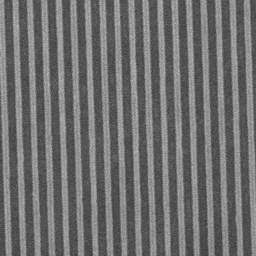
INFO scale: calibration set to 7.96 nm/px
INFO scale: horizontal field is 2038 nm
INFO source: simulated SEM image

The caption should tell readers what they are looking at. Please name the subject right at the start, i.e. parallel lines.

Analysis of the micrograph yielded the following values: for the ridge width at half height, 44.8 nanometers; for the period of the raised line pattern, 115 nm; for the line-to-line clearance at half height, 74.6 nanometers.